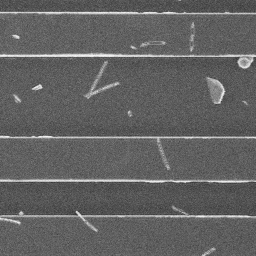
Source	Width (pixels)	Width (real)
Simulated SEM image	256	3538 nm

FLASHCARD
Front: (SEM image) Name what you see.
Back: lines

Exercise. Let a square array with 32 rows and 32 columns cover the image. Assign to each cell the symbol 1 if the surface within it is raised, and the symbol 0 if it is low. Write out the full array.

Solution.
00000000000000000000000000000000
00000000000000000000000000000000
11111111111111111111111111111111
11111111111111111111111111111111
11111111111111111111111111111111
11111111111111111111111111111111
11111111111111111111111111111111
00000000000000000000000000000010
00000000000000000000000000000000
00000000000000000000000000000000
00000000000000000000000000000000
00000000000000000000000000010000
00000000000000000000000000000000
00000000000000000000000000000000
00000000000000000000000000000000
00000000000000000000000000000000
00000000000000000000000000000000
11111111111111111111111111111111
11111111111111111111111111111111
11111111111111111111111111111111
11111111111111111111111111111111
11111111111111111111111111111111
11111111111111111111111111111111
00000000000000000000000000000000
00000000000000000000000000000000
00000000000000000000000000000000
00000000000000000000000000000000
11111111111111111111111111111111
11111111111111111111111111111111
11111111111111111111111111111111
11111111111111111111111111111111
11111111111111111111111111111111